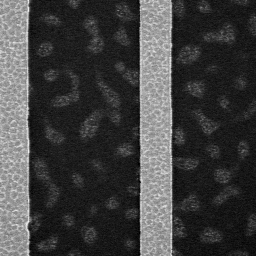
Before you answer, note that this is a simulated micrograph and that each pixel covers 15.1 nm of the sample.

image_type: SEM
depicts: one or a few lines or trenches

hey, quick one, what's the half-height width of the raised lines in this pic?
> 464 nanometres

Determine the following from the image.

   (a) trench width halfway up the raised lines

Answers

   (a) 1700 nanometers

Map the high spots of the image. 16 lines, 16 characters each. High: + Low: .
++.......++.....
++.......++.....
++.......++.....
++.......++.....
++.......++.....
++.......++.....
++.......++.....
++.......++.....
++.......++.....
++.......++.....
++.......++.....
++.......++.....
++.......++.....
++.......++.....
++.......++.....
++.......++.....